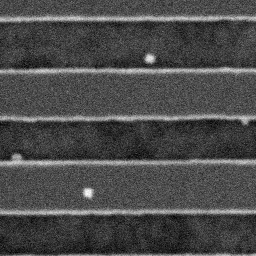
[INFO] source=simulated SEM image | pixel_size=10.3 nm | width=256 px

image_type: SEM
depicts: lines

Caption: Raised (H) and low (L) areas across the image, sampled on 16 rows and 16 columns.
HHHHHHHHHHHHHHHH
LLLLLLLLLLLLLLLL
LLLLLLLLLLLLLLLL
LLLLLLLLLLLLLLLL
HHHHHHHHHHHHHHHH
HHHHHHHHHHHHHHHH
HHHHHHHHHHHHHHHH
LHHLLLLLLLLLLLLL
LLLLLLLLLLLLLLLL
LLLLLLLLLLLLLLLL
HHHHHHHHHHHHHHHH
HHHHHHHHHHHHHHHH
HHHHHHHHHHHHHHHH
LLLLLLLLLLLLLLLL
LLLLLLLLLLLLLLLL
LLLLLLLLLLLLLLLL